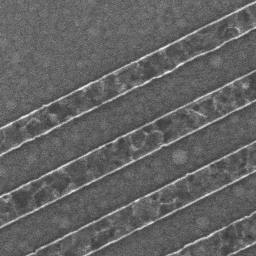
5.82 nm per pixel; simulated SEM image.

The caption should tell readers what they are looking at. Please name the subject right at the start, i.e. one or a few lines or trenches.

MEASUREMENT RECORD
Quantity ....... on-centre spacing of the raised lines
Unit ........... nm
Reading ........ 368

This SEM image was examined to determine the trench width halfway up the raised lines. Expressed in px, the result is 36.9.